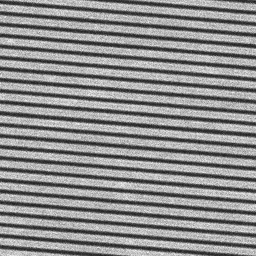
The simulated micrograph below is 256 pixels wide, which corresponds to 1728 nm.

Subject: parallel lines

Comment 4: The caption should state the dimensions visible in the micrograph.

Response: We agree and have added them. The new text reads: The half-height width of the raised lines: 0.0428 micrometres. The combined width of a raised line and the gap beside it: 74.8 nm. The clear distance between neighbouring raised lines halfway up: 0.0302 microns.